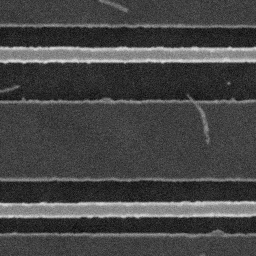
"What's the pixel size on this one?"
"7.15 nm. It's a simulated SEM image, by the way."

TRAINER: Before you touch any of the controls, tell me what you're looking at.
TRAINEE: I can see lines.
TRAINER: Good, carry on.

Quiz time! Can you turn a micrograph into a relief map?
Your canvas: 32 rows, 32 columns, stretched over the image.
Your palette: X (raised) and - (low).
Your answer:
XXXXXXXXXXXXXXXXXXXXXXXXXXXXXXXX
XXXXXXXXXXXXXXXXXXXXXXXXXXXXXXXX
XXXXXXXXXXXXXXXXXXXXXXXXXXXXXXXX
--------------------------------
--------------------------------
--------------------------------
XXXXXXXXXXXXXXXXXXXXXXXXXXXXXXXX
XXXXXXXXXXXXXXXXXXXXXXXXXXXXXXXX
--------------------------------
--------------------------------
--------------------------------
--------------------------------
--------------------------------
XXXXXXXXXXXXXXXXXXXXXXXXXXXXXXXX
XXXXXXXXXXXXXXXXXXXXXXXXXXXXXXXX
XXXXXXXXXXXXXXXXXXXXXXXXXXXXXXXX
XXXXXXXXXXXXXXXXXXXXXXXXXXXXXXXX
XXXXXXXXXXXXXXXXXXXXXXXXXXXXXXXX
XXXXXXXXXXXXXXXXXXXXXXXXXXXXXXXX
XXXXXXXXXXXXXXXXXXXXXXXXXXXXXXXX
XXXXXXXXXXXXXXXXXXXXXXXXXXXXXXXX
XXXXXXXXXXXXXXXXXXXXXXXXXXXXXXXX
--XX-XXXXXXX--XXXX--XXXXXX-XXXXX
--------------------------------
--------------------------------
XXXXXXXXXXXXXXXXXXXXXXXXXXXXXXXX
XXXXXXXXXXXXXXXXXXXXXXXXXXXXXXXX
--------------------------------
--------------------------------
XXXXXXXXXXXXXXXXXXXXXXXXXXXXXXXX
XXXXXXXXXXXXXXXXXXXXXXXXXXXXXXXX
XXXXXXXXXXXXXXXXXXXXXXXXXXXXXXXX